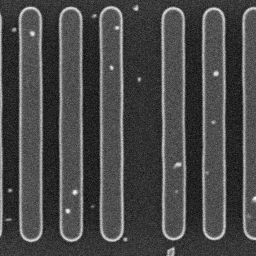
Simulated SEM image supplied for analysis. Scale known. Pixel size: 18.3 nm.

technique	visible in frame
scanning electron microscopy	groups of lines, slits or small figures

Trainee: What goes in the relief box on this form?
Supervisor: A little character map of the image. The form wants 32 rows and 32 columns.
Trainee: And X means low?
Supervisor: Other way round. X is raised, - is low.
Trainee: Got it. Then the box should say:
--------------------------------
---XX---XX---XX------XX---XX---X
---XX--XXX---XX-----XXX--XXX--XX
---XX--XXX---XX-----XXX--XXX--XX
---XX--XXX---XX-----XXX--XXX--XX
---XX---XX---XX-----XXX--XXX---X
---XX---XX---XX-----XXX--XXX--XX
---XX---XX---XX-----XXX--XXX--XX
---XX---XX---XX-----XXX--XXX--XX
---XX---XX---XX-----XXX--XXX--XX
---XX---XX---XX-----XXX--XXX--XX
---XX---XX---XX-----XXX--XXX---X
---XX---XX---XX-----XXX--XXX---X
---XX---XX---XX-----XXX--XXX---X
---XX---XX---XX-----XXX--XXX---X
---XX--XXX---XX-----XXX--XXX---X
---XX--XXX---XX-----XXX--XXX---X
---XX--XXX---XX-----XXX--XXX---X
---XX---XX---XX-----XXX--XXX---X
---XX---XX---XX-----XXX--XXX---X
---XX---XX---XX-----XXX--XXX---X
---XX---XX---XX-----XXX--XXX---X
---XX---XX---XX-----XXX--XXX---X
---XX---XX---XX-----XXX--XXX---X
---XX---XX---XX-----XXX--XXX---X
---XX---XX---XX-----XXX--XXX---X
---XX---XX---XX-----XXX--XXX---X
---XX---XX---XX-----XXX--XXX---X
---XX---XX---XX-----XXX--XXX---X
---XX---XX---XX------XX---XX---X
--------------------------------
--------------------------------